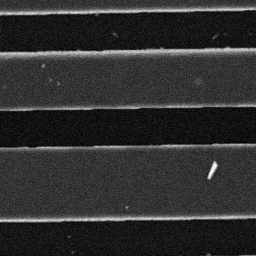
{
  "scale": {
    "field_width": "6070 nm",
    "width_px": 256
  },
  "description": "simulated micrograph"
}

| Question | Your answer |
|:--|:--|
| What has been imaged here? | lines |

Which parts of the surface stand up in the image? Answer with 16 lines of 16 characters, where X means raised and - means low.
XXXXXXXXXXXXXXXX
----------------
----------------
XXXXXXXXXXXXXXXX
XXXXXXXXXXXXXXXX
XXXXXXXXXXXXXXXX
XXXXXXXXXXXXXXXX
----------------
----------------
XXXXXXXXXXXXXXXX
XXXXXXXXXXXXXXXX
XXXXXXXXXXXXXXXX
XXXXXXXXXXXXXXXX
XXXXXXXXXXXXXXXX
----------------
----------------